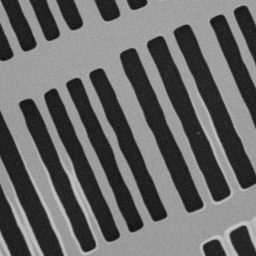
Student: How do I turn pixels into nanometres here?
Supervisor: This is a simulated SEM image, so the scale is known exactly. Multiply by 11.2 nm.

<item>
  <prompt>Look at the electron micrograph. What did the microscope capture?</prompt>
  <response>groups of lines, slits or small figures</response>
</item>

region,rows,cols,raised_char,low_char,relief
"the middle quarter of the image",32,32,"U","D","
UUUUUUUUUUUUUUDDDDDDUUUDDDDDUUUD
UUUUUUUDDDUUUUUDDDDDUUUDDDDDDUUD
UUUUUUDDDDUUUUUDDDDDDUUUDDDDDUUU
UUUDUUDDDDDUUUUUDDDDDUUUDDDDDDUU
UDDDDUUDDDDUUUUUDDDDDDUUUDDDDDUU
UDDDDUUDDDDDUUUUUDDDDDUUUDDDDDUU
UDDDDUUUDDDDDUUUUDDDDDUUUDDDDDDU
UDDDDDUUDDDDDUUUUUDDDDDUUUDDDDDU
UUDDDDUUUDDDDUUUUUDDDDDUUUDDDDDD
UUDDDDUUUDDDDDUUUUUDDDDDUUUDDDDD
UUUDDDDUUDDDDDUUUUUDDDDDUUUDDDDD
DUUDDDDUUUDDDDDUUUUDDDDDDUUDDDDD
DUUUDDDDUUDDDDDUUUUUDDDDDUUUDDDD
DUUUDDDDDUUDDDDDUUUUDDDDDUUUUDDD
DDUUDDDDDUUDDDDDUUUUUDDDDDUUUDDD
DDUUUDDDDUUUDDDDUUUUUDDDDDUUUDDD
DDDUUDDDDDUUDDDDDUUUUUDDDDDUUUDD
DDDUUUDDDDUUUDDDDUUUUUDDDDDUUUDD
DDDDUUDDDDDUUDDDDDUUUUUDDDDDUUUD
DDDDUUDDDDDUUDDDDDUUUUUDDDDDUUUD
DDDDDUUDDDDDUUDDDDUUUUUDDDDDDUUD
DDDDDUUDDDDDUUDDDDDUUUUUDDDDDUUU
UDDDDUUUDDDDDUUDDDDUUUUUDDDDDDUU
UDDDDDUUDDDDDUUDDDDDUUUUUDDDDDUU
UUDDDDUUUDDDDUUUDDDDUUUUUDDDDDUU
UUDDDDDUUDDDDDUUDDDDDUUUUUDDDDDU
UUDDDDDUUUDDDDUUUDDDDUUUUUDDDDDU
DUUDDDDDUUDDDDUUUDDDDUUUUUDDDDDD
DDUDDDDDUUUDDDDUUDDDDDUUUUUDDDDD
DDUDDDDDDUUDDDDUUUDDDDUUUUUDDDDD
DDUUDDDDDUUDDDDDUUDDDDDUUUUUDDDD
DDDUDDDDDUUUDDDDUUUDDDDUUUUUDDDD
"